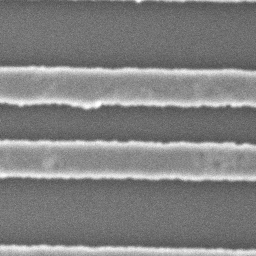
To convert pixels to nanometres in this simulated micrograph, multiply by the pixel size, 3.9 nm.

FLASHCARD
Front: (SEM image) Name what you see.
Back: lines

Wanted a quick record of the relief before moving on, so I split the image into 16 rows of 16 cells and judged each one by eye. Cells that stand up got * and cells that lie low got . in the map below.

................
................
................
................
****************
****************
.*..************
................
................
****************
****************
................
................
................
................
*********.......